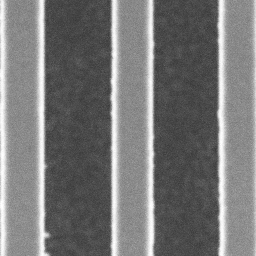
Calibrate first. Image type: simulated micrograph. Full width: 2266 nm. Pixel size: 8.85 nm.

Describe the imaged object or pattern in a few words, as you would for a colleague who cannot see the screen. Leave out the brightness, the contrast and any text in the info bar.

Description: lines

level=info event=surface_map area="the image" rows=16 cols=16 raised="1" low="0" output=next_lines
1110000111000011
1110000111000011
1110000111000011
1110000111000011
1110000111000011
1110000111000011
1110000111000011
1110000111000011
1110000111000011
1110000111000011
1110000111000011
1110000111000011
1110000111000011
1110000111000011
1110000111000011
1110000111000011